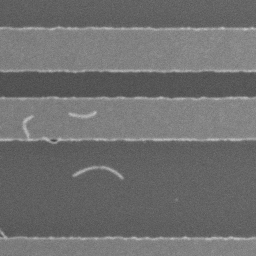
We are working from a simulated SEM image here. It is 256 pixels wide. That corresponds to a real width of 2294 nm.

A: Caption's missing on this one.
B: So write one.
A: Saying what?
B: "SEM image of lines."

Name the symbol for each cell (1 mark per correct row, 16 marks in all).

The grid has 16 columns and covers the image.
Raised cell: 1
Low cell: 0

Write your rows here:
0000000000000000
0000000000000000
1111111111111111
1111111111111111
0000000000000000
0000000000000000
1111111111111111
1111111111111111
1111111111111111
0000000000000000
0000000000000000
0000000000000000
0000000000000000
0000000000000000
0000000000000000
1111111111111111